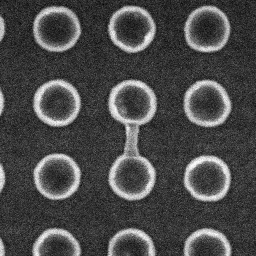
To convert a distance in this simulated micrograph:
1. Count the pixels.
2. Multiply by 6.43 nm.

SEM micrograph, raised bodies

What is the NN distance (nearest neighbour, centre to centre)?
479 nanometres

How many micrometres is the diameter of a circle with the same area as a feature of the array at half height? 0.282